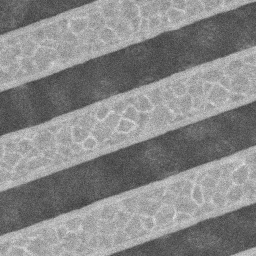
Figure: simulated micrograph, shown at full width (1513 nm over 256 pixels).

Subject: one or a few lines or trenches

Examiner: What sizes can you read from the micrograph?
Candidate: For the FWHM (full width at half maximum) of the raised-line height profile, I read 273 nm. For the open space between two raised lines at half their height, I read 49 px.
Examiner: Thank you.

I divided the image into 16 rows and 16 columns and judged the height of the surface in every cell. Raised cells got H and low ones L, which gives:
LLLLLHHHHHHHHHLL
LLLHHHHHHHHLLLLL
HHHHHHHHHLLLLLLL
HHHHHHLLLLLLLLLH
HHHLLLLLLLLLHHHH
LLLLLLLLLHHHHHHH
LLLLLLHHHHHHHHHL
LLLLHHHHHHHHLLLL
LHHHHHHHHLLLLLLL
HHHHHHLLLLLLLLLL
HHHHLLLLLLLLLHHH
HLLLLLLLLLHHHHHH
LLLLLLLHHHHHHHHH
LLLLHHHHHHHHHLLL
LHHHHHHHHHLLLLLL
HHHHHHHLLLLLLLLL